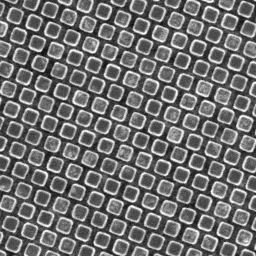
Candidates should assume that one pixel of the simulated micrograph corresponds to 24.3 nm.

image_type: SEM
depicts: a regular array of raised bodies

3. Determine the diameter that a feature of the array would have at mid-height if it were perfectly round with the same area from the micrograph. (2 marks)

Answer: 378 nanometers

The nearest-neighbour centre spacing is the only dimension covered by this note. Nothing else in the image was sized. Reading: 488 nanometres